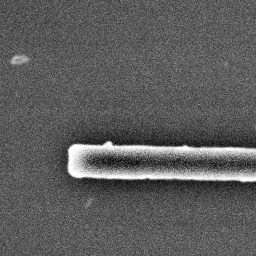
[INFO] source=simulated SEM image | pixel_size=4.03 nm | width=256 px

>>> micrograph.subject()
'one or a few lines or trenches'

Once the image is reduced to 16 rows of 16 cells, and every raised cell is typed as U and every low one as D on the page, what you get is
DDDDDDDDDDDDDDDD
DDDDDDDDDDDDDDDD
DDDDDDDDDDDDDDDD
DDDDDDDDDDDDDDDD
DDDDDDDDDDDDDDDD
DDDDDDDDDDDDDDDD
DDDDDDDDDDDDDDDD
DDDDDDDDDDDDDDDD
DDDDDDDDDDDDDDDD
DDDDUUUUUUUUUUUU
DDDDUUUUUUUUUUUU
DDDDDDDDDDDDDDDD
DDDDDDDDDDDDDDDD
DDDDDDDDDDDDDDDD
DDDDDDDDDDDDDDDD
DDDDDDDDDDDDDDDD